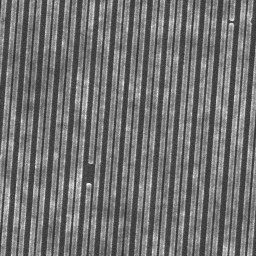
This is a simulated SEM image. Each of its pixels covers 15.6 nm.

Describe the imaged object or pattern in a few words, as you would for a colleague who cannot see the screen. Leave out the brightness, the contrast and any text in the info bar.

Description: parallel lines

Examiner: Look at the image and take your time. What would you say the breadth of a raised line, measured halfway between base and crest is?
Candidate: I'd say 76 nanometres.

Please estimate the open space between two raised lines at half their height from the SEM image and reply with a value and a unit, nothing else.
91.6 nm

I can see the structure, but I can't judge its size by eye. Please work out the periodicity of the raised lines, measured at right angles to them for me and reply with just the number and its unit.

8.77 pixels